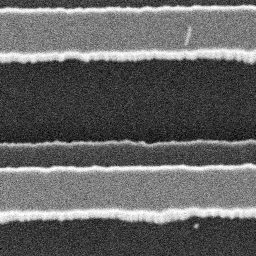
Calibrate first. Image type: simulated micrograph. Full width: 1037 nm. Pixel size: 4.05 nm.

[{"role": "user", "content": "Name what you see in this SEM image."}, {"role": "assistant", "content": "lines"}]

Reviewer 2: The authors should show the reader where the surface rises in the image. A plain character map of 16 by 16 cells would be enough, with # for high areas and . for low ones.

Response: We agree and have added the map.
......##.#######
################
################
.#..............
................
................
................
................
................
................
################
################
################
................
................
................